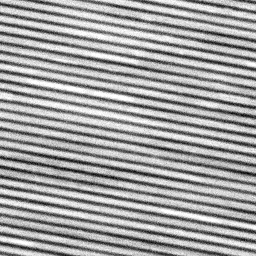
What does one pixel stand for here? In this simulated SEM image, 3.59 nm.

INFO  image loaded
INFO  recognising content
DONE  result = parallel lines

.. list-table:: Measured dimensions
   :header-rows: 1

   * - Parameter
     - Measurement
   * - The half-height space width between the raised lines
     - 16.7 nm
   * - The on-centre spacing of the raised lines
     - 0.0338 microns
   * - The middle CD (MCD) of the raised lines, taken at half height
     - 0.0167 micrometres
